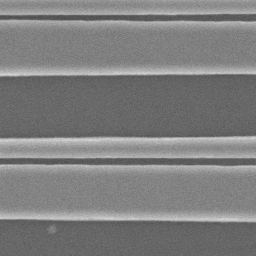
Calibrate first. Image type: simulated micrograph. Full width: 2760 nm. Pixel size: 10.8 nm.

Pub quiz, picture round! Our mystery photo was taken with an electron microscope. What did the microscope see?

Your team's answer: lines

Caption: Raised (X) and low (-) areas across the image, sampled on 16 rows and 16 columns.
XXXXXXXXXXXXXXXX
XXXXXXXXXXXXXXXX
XXXXXXXXXXXXXXXX
XXXXXXXXXXXXXXXX
XXXXXXXXXXXXXXXX
----------------
----------------
----------------
----------------
XXXXXXXXXXXXXXXX
XXXXXXXXXXXXXXXX
XXXXXXXXXXXXXXXX
XXXXXXXXXXXXXXXX
XXXXXXXXXXXXXXXX
----------------
----------------